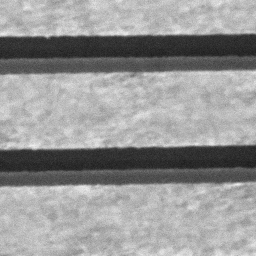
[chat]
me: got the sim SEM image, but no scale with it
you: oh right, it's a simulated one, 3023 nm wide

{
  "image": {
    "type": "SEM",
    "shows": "lines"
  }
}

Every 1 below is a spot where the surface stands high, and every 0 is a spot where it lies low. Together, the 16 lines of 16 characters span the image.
1111111111111111
1111111111111111
0000000000000000
0000000000000000
0000000000111111
1111111111111111
1111111111111111
1111111111111111
1111111111111111
0000000000000000
0000000000000000
0000000001111111
1111111111111111
1111111111111111
1111111111111111
1111111111111111